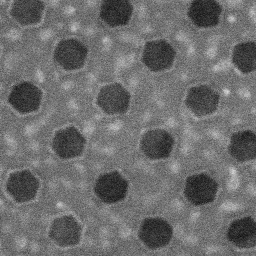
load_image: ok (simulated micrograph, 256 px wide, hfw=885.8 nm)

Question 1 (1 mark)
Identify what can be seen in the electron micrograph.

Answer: a regular array of raised bodies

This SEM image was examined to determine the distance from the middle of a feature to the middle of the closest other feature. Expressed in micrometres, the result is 0.216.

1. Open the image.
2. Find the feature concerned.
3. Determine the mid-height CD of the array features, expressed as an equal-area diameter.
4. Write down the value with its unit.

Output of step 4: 127 nm